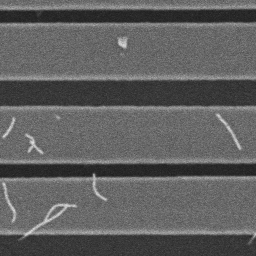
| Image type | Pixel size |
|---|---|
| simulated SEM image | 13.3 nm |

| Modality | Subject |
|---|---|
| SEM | lines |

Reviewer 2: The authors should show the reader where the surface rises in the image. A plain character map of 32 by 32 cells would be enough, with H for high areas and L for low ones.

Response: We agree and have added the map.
HHHHHHHHHHHHHHHHHHHHHHHHHHHHHHHH
LLLLLLLLLLLLLLLLLLLLLLLLLLLLLLLL
LLLLLLLLLLLLLLLLLLLLLLLLLLLLLLLL
HHHHHHHHHHHHHHHHHHHHHHHHHHHHHHHH
HHHHHHHHHHHHHHHHHHHHHHHHHHHHHHHH
HHHHHHHHHHHHHHHHHHHHHHHHHHHHHHHH
HHHHHHHHHHHHHHHHHHHHHHHHHHHHHHHH
HHHHHHHHHHHHHHHHHHHHHHHHHHHHHHHH
HHHHHHHHHHHHHHHHHHHHHHHHHHHHHHHH
HHHHHHHHHHHHHHHHHHHHHHHHHHHHHHHH
LLLLLLLLLLLLLLLLLLLLLLLLLLLLLLLL
LLLLLLLLLLLLLLLLLLLLLLLLLLLLLLLL
LLLLLLLLLLLLLLLLLLLLLLLLLLLLLLLL
HHHHHHHHHHHHHHHHHHHHHHHHHHHHHHHH
HHHHHHHHHHHHHHHHHHHHHHHHHHHHHHHH
HHHHHHHHHHHHHHHHHHHHHHHHHHHHHHHH
HHHHHHHHHHHHHHHHHHHHHHHHHHHHHHHH
HHHHHHHHHHHHHHHHHHHHHHHHHHHHHHHH
HHHHHHHHHHHHHHHHHHHHHHHHHHHHHHHH
HHHHHHHHHHHHHHHHHHHHHHHHHHHHHHHH
LLLLLLLLLLLLLLLLLLLLLLLLLLLLLLLL
LLLLLLLLLLLLLLLLLLLLLLLLLLLLLLLL
HHHHHHHHHHHHHHHHHHHHHHHHHHHHHHHH
HHHHHHHHHHHHHHHHHHHHHHHHHHHHHHHH
HHHHHHHHHHHHHHHHHHHHHHHHHHHHHHHH
HHHHHHHHHHHHHHHHHHHHHHHHHHHHHHHH
HHHHHHHHHHHHHHHHHHHHHHHHHHHHHHHH
HHHHHHHHHHHHHHHHHHHHHHHHHHHHHHHH
HHHHHHHHHHHHHHHHHHHHHHHHHHHHHHHH
LLLLLLLLLLLLLLLLLLLLLLLLLLLLLLLL
LLLLLLLLLLLLLLLLLLLLLLLLLLLLLLLL
LLLLLLLLLLLLLLLLLLLLLLLLLLLLLLLL